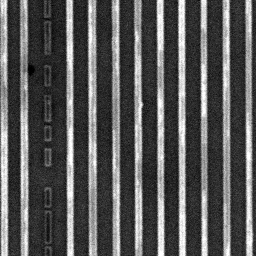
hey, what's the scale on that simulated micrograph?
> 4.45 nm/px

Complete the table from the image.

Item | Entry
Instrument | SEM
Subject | parallel lines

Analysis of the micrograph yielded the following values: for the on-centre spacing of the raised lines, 99.2 nm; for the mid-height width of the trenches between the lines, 75.1 nanometres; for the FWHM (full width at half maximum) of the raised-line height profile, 5.87 pixels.